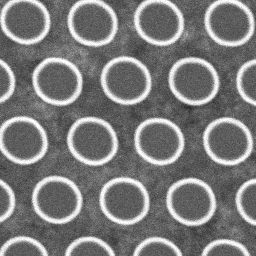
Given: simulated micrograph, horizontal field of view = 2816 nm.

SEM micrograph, a regular array of raised bodies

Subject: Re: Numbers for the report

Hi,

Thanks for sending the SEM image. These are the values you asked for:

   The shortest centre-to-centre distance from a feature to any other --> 0.742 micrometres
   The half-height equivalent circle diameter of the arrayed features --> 495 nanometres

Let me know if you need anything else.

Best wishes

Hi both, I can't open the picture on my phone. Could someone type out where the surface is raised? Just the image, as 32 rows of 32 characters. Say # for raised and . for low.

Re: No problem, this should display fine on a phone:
.####.....###.....###......###..
######...#####...#####....#####.
######...#####...######...######
.#####...#####...######...######
.####....#####....####.....####.
............#...............##..
................................
...............##...............
#....####....#####....####....##
#...######...######..######...##
##..######...######..######...##
#....#####...#####....#####...##
......###......##......###.....#
................................
................................
.####.....###.....###......###..
#####....#####...#####....#####.
######...#####...######...#####.
######...#####...######...#####.
.####.....####....####.....####.
................................
................................
......##.......#................
#....####....#####....####....##
##..######...#####...#####....##
##..######...#####...######...##
#....#####...#####...#####....##
......##......###.....####.....#
................................
................................
.####....####.....###......###..
######...#####...#####....#####.